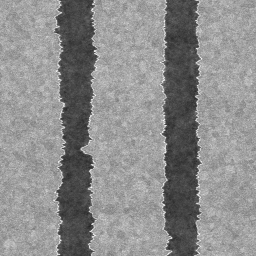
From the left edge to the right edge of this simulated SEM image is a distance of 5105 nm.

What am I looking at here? one or a few lines or trenches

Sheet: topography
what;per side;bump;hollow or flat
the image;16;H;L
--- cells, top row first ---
HHHHLLHHHHLLHHHH
HHHLLLHHHHLLHHHH
HHHHLLHHHHLLHHHH
HHHHLLHHHHLLHHHH
HHHHLLHHHHLLHHHH
HHHHLLHHHHLLHHHH
HHHHLLHHHHLLHHHH
HHHHLLHHHHLLHHHH
HHHHLLHHHHLLHHHH
HHHHLHHHHHLLHHHH
HHHHLLHHHHLLHHHH
HHHHLLHHHHLLHHHH
HHHHLLHHHHLLHHHH
HHHHLLHHHHLLHHHH
HHHHLLHHHHLLHHHH
HHHHLLHHHHLLHHHH